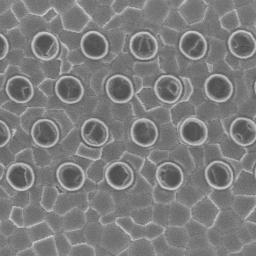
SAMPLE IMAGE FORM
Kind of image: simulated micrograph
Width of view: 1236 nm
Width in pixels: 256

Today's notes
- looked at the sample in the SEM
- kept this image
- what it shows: a regular array of raised bodies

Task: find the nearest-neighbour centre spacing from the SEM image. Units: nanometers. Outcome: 238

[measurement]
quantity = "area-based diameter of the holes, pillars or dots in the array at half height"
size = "0.129 um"